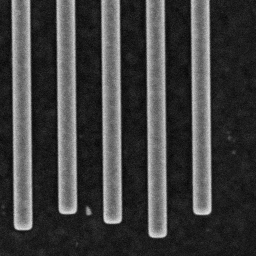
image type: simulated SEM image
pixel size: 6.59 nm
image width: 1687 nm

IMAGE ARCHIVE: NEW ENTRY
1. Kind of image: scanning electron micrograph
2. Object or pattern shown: groups of lines, slits or small figures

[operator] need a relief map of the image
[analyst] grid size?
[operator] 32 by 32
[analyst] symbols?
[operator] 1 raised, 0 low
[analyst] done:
01110001100001100011000011000000
00110001100001100011000011000000
00110001100001100011000011000000
00110001100001100011100011000000
00110001100001100011100011000000
00110001100001100011100011000000
00110001100001100011100011000000
00110001100001100011100011000000
00110001100001100011100011000000
00110001100001100011100011000000
00110001100001100011100011000000
00110001100001100011100011000000
00110001100001100001100011000000
00110001100001100001100011000000
00110001100001100001100011000000
00110001100001100001100011000000
00110001110001100001100011000000
00110001110001100001100011000000
00110001110001100001100011000000
00110001110001100001100011000000
00110001110001100001100011000000
00110001110001100001100011000000
00110001110001100001100011000000
00110001110001100001100011000000
00110001110001100001100011000000
00110001110001100001100011000000
00110000100001100001100011000000
00110000000001100001100000000000
00110000000000000001100000000000
00000000000000000001000000000000
00000000000000000000000000000000
00000000000000000000000000000000